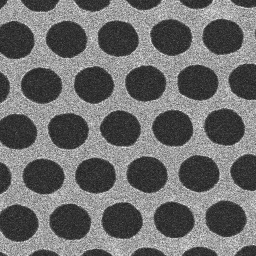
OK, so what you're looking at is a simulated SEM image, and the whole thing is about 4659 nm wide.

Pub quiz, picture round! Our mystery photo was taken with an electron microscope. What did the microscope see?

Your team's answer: a regular array of holes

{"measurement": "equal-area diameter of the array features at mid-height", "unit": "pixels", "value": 38.3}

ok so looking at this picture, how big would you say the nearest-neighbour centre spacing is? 940 nm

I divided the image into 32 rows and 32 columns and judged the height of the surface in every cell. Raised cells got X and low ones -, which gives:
-XX----XXX----XX----XXX---XXX---
XXXXXXXXXXXXXXXXXXXXXXXXXXXXXXXX
XXXXXXXXXXXXXXXXXXXXX-XXXXX--XXX
----XX----XXX----XX-----XX----XX
----XX-----X-----XX-----X-----XX
----XX-----X-----XX-----XX----XX
----XXX---XXX----XXX---XXX---XXX
XXXXXXXXXXXXXXXXXXXXXXXXXXXXXXXX
XXXX-XXXXXX--XXXX---XXX---XXXX--
-XX----XXX----XX----XX-----XX---
-XX-----X-----XX-----X-----XX---
-XX-----XX----XX----XXX----XX---
-XXX---XXX---XXXX--XXXXXXXXXXXX-
XXXXXXXXXXXXXXXXXXXXXXXXXXXXXXXX
X--XXXX---XXX----XXX---XXX----XX
----XX-----XX----XX-----XX----XX
-----X-----XX-----X-----XX-----X
----XX-----XX----XXX----XX----XX
X--XXXXX--XXXXXXXXXXXXXXXXXXXXXX
XXXXXXXXXXXXXXXXXXXXXXXX-XXXXX--
XXXX---XXX----XX----XXX----XX---
-XX-----X-----XX-----X-----XX---
-XX-----X-----XX-----XX----XX---
-XXX---XXX----XXX---XXX---XXXX--
XXXXXXXXXXXXXXXXXXXXXXXXXXXXXXXX
XXXXXXXX-XXXXX--XXXX--XXXXX---XX
----XXX----XX----XX-----XX-----X
-----X-----XX-----X-----XX-----X
-----X-----XX-----XX----XX----XX
X---XXX----XXX---XXXX--XXXXX-XXX
XXXXXXXXXXXXXXXXXXXXXXXXXXXXXXXX
XXXX---XXXX--XXXX---XXX----XXX--